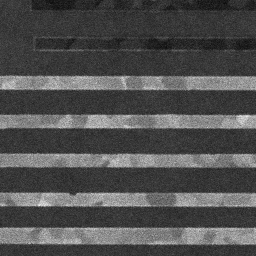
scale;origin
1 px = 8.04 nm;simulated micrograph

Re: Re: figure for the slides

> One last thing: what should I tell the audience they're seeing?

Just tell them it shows parallel lines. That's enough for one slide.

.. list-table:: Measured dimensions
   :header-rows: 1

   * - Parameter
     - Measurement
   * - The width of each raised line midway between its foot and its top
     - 0.0984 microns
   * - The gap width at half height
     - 26.5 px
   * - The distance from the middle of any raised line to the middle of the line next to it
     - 0.308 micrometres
